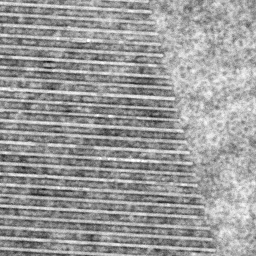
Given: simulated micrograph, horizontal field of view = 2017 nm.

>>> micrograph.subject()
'parallel lines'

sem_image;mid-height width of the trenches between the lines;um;0.0658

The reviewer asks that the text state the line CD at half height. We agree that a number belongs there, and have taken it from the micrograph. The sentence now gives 2.49 px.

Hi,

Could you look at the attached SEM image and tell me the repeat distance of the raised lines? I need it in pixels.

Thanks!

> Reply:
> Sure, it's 10.7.